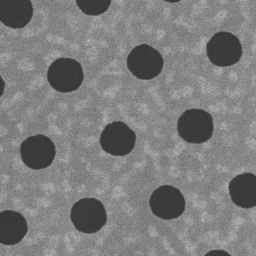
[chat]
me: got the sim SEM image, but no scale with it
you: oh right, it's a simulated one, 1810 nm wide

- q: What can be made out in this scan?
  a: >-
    a regular array of holes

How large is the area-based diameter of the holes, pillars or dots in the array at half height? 251 nm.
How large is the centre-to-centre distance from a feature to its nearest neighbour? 80 pixels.